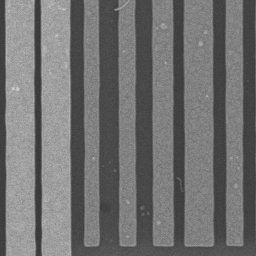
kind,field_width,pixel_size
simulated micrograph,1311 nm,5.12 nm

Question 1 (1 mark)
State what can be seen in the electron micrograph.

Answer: groups of lines, slits or small figures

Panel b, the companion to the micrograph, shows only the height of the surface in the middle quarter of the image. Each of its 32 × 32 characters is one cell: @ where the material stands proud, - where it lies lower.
@----@@@@-----@@@@----@@@@@---@@
@----@@@@-----@@@@----@@@@@---@@
@----@@@@-----@@@@----@@@@@---@@
@----@@@@-----@@@@----@@@@@---@@
@----@@@@-----@@@@----@@@@@---@@
@----@@@@-----@@@@----@@@@@---@@
@----@@@@-----@@@@----@@@@@---@@
@----@@@@-----@@@@----@@@@@---@@
@----@@@@-----@@@@----@@@@@---@@
@----@@@@-----@@@@----@@@@@---@@
@----@@@@-----@@@@----@@@@@---@@
@----@@@@-----@@@@----@@@@@---@@
@----@@@@-----@@@@----@@@@@---@@
@----@@@@-----@@@@----@@@@@---@@
@----@@@@-----@@@@----@@@@@---@@
@----@@@@-----@@@@----@@@@@---@@
@----@@@@-----@@@@----@@@@@---@@
@----@@@@-----@@@@----@@@@@---@@
@----@@@@-----@@@@----@@@@@---@@
@----@@@@-----@@@@----@@@@@---@@
@----@@@@-----@@@@----@@@@@---@@
@----@@@@-----@@@@----@@@@@---@@
@----@@@@-----@@@@----@@@@@---@@
@----@@@@-----@@@@----@@@@@---@@
@----@@@@-----@@@@----@@@@@---@@
@----@@@@-----@@@@----@@@@@---@@
@----@@@@-----@@@@----@@@@@---@@
@----@@@@-----@@@@----@@@@@---@@
@----@@@@-----@@@@----@@@@@---@@
@@---@@@@-----@@@@----@@@@@---@@
@@---@@@@-----@@@@----@@@@@---@@
@@---@@@@-----@@@@----@@@@@---@@